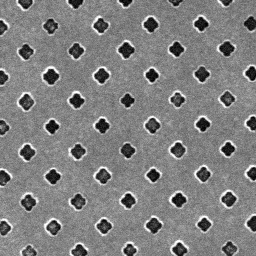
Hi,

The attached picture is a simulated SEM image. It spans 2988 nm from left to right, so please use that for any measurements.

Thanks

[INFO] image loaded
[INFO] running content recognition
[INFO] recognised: a regular array of holes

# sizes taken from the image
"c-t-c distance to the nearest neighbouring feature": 412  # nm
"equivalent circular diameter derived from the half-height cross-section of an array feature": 14.6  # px